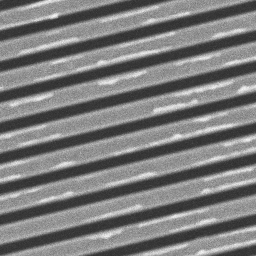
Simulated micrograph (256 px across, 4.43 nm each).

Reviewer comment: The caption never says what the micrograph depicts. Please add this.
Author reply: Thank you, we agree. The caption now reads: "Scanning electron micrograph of parallel lines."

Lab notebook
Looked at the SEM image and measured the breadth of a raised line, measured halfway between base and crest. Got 17.7 pixels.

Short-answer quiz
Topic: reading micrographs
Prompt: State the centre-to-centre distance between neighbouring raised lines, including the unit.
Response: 0.132 um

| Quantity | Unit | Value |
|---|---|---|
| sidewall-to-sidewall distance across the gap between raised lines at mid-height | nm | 54.9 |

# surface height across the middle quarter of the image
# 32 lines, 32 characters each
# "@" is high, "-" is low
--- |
@@@@@@@@@@-------------@@@@@@@@@
@@@@@--------------@@@@@@@@@@@@@
@--------------@@@@@@@@@@@@@@@@@
-----------@@@@@@@@@@@@@@@@@----
-------@@@@@@@@@@@@@@@@@--------
--@@@@@@@@@@@@@@@@@@------------
@@@@@@@@@@@@@@@@---------------@
@@@@@@@@@@@@--------------@@@@@@
@@@@@@@@--------------@@@@@@@@@@
@@@@--------------@@@@@@@@@@@@@@
--------------@@@@@@@@@@@@@@@@@@
----------@@@@@@@@@@@@@@@@@@----
------@@@@@@@@@@@@@@@@@---------
-@@@@@@@@@@@@@@@@@@-------------
@@@@@@@@@@@@@@@--------------@@@
@@@@@@@@@@@-------------@@@@@@@@
@@@@@@@-------------@@@@@@@@@@@@
@@@-------------@@@@@@@@@@@@@@@@
------------@@@@@@@@@@@@@@@@@@@-
--------@@@@@@@@@@@@@@@@@@@-----
----@@@@@@@@@@@@@@@@@@----------
@@@@@@@@@@@@@@@@@@--------------
@@@@@@@@@@@@@@--------------@@@@
@@@@@@@@@@--------------@@@@@@@@
@@@@@@-------------@@@@@@@@@@@@@
@@-------------@@@@@@@@@@@@@@@@@
-----------@@@@@@@@@@@@@@@@@@---
-------@@@@@@@@@@@@@@@@@@-------
---@@@@@@@@@@@@@@@@@@-----------
@@@@@@@@@@@@@@@@--------------@@
@@@@@@@@@@@@--------------@@@@@@
@@@@@@@@---------------@@@@@@@@@